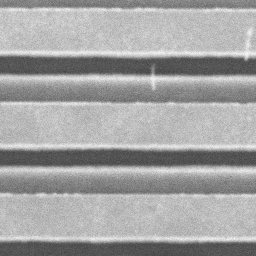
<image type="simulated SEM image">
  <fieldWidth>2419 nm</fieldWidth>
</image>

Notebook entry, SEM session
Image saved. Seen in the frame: lines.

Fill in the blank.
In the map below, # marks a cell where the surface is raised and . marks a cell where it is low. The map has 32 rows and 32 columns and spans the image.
################################
################################
################################
################################
################################
################################
################################
................................
................................
................................
################################
################################
################################
################################
################################
################################
################################
################################
................................
................................
................................
################################
################################
################################
################################
################################
################################
################################
################################
################################
................................
................................